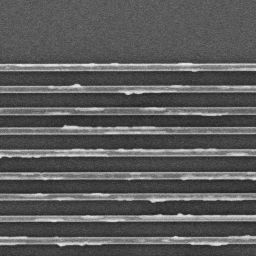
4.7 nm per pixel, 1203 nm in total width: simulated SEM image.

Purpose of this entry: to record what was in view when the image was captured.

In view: parallel lines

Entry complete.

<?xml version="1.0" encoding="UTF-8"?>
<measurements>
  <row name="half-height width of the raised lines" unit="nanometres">31.7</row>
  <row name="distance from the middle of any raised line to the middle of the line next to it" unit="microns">0.102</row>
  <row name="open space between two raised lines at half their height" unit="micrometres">0.0722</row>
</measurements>